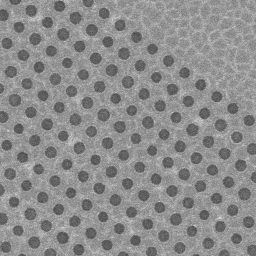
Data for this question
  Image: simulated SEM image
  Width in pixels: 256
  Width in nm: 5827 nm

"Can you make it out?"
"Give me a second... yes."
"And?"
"a regular array of holes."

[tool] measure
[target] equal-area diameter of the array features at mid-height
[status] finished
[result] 277 nm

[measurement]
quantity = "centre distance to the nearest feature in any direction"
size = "454 nanometres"